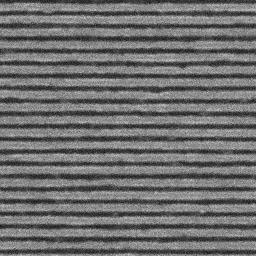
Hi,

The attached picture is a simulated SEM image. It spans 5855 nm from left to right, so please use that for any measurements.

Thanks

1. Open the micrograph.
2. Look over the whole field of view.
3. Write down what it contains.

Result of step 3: parallel lines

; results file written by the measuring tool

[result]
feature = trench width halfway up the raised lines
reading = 0.146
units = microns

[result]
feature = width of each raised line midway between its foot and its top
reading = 6.25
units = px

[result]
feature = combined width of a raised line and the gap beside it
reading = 287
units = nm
